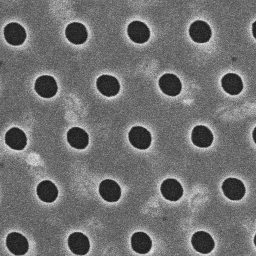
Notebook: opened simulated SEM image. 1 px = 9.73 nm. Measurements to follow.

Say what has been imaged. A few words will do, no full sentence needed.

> a regular array of holes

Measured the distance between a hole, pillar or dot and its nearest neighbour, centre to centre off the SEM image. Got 592 nm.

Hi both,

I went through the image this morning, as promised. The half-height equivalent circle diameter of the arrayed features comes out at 226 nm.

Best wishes